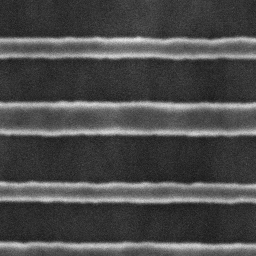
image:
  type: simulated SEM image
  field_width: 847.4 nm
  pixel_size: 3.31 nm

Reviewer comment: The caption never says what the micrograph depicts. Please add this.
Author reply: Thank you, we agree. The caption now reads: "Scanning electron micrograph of lines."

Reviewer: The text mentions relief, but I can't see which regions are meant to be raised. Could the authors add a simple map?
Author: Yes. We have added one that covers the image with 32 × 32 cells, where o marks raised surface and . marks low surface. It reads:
................................
................................
................................
................................
................................
oooooooooooooooooooooooooooooooo
oooooooooooooooooooooooooooooooo
................................
................................
................................
................................
................................
................................
oooooooooooooooooooooooooooooooo
oooooooooooooooooooooooooooooooo
oooooooooooooooooooooooooooooooo
oooooooooooooooooooooooooooooooo
................................
................................
................................
................................
................................
................................
oooooooooooooooooooooooooooooooo
oooooooooooooooooooooooooooooooo
................................
................................
................................
................................
................................
ooooooooooooooooooooooooo....o..
oooooooooooooooooooooooooooooooo